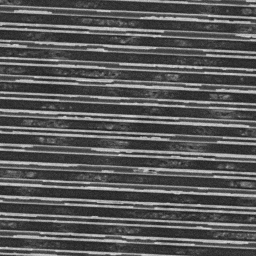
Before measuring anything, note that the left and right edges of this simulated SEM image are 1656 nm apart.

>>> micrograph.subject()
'parallel lines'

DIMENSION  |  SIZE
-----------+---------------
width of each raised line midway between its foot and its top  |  7.11 pixels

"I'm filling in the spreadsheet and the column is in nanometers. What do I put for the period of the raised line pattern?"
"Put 112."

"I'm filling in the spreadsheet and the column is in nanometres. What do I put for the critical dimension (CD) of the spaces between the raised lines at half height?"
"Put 68.7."